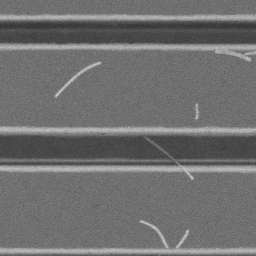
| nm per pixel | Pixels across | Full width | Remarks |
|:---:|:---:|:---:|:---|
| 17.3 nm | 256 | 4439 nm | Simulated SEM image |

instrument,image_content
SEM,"lines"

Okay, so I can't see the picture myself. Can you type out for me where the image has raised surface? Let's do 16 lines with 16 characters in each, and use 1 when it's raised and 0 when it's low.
1111111111111111
0000000000000000
0000000000000000
1111111111111111
1111111111111111
1111111111111111
1111111111111111
1111111111111111
0000000000000000
0000000000000000
1111111111111111
1111111111111111
1111111111111111
1111111111111111
1111111111111111
1111111111111111